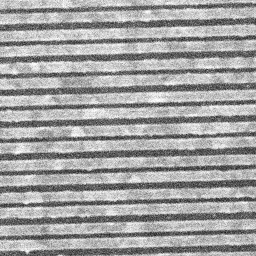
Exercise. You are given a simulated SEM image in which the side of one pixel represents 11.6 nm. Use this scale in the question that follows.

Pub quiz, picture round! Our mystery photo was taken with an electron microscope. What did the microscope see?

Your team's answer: parallel lines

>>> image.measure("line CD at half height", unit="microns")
0.11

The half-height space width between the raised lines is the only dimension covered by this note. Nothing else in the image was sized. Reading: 0.0719 microns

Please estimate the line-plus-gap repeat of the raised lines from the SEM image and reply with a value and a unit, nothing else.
188 nm